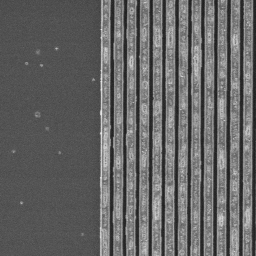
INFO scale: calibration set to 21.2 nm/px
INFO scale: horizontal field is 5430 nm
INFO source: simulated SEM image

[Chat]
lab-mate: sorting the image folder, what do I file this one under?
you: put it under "parallel lines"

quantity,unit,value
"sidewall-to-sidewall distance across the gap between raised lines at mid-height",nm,98.1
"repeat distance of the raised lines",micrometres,0.275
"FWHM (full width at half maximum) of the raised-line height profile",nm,175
